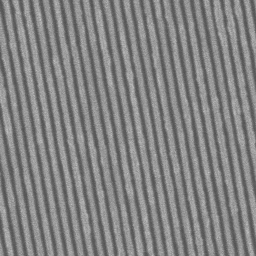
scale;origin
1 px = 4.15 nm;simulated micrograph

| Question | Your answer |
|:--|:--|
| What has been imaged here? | parallel lines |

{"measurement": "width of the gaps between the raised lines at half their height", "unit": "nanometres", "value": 18.8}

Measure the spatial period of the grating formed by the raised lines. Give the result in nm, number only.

41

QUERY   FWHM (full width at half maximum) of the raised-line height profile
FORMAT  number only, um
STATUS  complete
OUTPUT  0.023